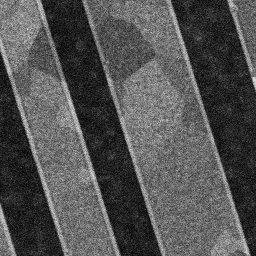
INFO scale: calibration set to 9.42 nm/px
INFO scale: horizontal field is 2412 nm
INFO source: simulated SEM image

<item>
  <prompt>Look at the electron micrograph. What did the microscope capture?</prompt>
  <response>one or a few lines or trenches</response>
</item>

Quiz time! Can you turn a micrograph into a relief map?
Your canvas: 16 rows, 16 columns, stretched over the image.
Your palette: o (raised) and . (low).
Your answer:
ooo..oooooo...oo
ooo...ooooo....o
ooo...ooooo....o
ooo...oooooo...o
.ooo...ooooo....
.ooo...ooooo....
.ooo...oooooo...
..ooo...ooooo...
..ooo...ooooo...
..ooo...ooooo...
..oooo...ooooo..
...ooo...ooooo..
...ooo...ooooo..
...oooo..oooooo.
....ooo...ooooo.
o...ooo...ooooo.